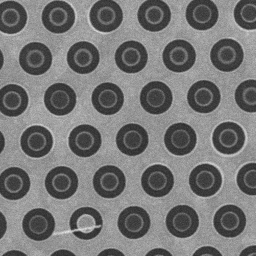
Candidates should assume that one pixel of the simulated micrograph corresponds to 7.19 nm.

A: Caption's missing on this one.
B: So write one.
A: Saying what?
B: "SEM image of an array of small figures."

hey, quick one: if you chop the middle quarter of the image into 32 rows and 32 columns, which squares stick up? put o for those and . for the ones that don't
o........oooo.......ooooo.......
oo......oooooo......oooooo.....o
oooo..oooooooooooooooooooooooooo
oooooooooooooooooooooooooooooooo
oooooooooo..ooooooooo....ooooooo
..oooooo......oooooo......oooooo
...oooo.......ooooo...oo...oooo.
o..oooo..oooo..oooo..oooo..oooo.
o..oooo..oooo..oooo..oooo..oooo.
o..oooo..oooo..oooo..oooo..oooo.
o..oooo...oo...oooo...oo...oooo.
..oooooo......oooooo......oooooo
.oooooooo....ooooooooo..oooooooo
oooooooooooooooooooooooooooooooo
oooooooooooooooooooooooooooo.ooo
ooo....oooooooo....ooooooo......
oo......oooooo......oooooo......
o...oo...oooo...ooo..oooo..oooo.
o..oooo..oooo..oooo..oooo..oooo.
o..oooo..oooo..oooo..oooo..oooo.
o...ooo..oooo...ooo..oooo...ooo.
oo.......ooooo......oooooo......
ooo.....ooooooo....oooooooo....o
oooooooooooooooooooooooooooooooo
oooooooooooooooooooooooooooooooo
.ooooooooo..ooooooooo....ooooooo
..oooooo......oooooo.......ooooo
...ooooo...o...ooooo..ooo..oooo.
o..oooo...ooo..oooo..oooo..oooo.
o...ooo..oooo...ooo..ooooo.oooo.
o..oooo...ooo..oooo...ooo..oooo.
o..ooooo.......ooooo.......ooooo